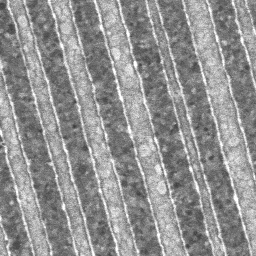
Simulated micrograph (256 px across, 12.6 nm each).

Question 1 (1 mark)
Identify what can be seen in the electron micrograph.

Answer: parallel lines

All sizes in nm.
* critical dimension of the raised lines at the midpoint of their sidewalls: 325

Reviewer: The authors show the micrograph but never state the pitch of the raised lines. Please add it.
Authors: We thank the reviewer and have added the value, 0.538 um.